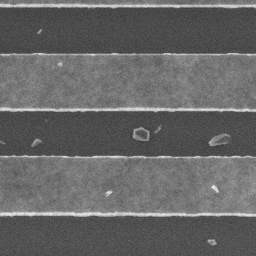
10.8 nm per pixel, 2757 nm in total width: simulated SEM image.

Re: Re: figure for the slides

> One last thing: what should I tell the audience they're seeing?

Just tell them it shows lines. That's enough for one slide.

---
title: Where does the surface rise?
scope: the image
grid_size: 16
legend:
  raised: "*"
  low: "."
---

................
................
................
****************
****************
****************
****************
................
................
................
****************
****************
****************
................
................
................